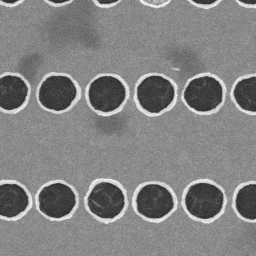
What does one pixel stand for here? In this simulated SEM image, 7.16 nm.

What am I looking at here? a regular array of holes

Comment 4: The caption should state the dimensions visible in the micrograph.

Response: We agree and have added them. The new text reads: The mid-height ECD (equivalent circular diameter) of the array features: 279 nm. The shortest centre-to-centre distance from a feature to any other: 348 nm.